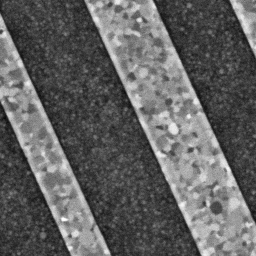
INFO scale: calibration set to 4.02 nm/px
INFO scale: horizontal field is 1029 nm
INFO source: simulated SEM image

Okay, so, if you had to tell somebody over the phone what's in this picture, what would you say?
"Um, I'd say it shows one or a few lines or trenches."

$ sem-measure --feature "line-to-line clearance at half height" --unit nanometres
343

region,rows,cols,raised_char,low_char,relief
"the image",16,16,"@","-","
------@@@@-----@
------@@@@-----@
@------@@@@-----
@------@@@@-----
@@-----@@@@-----
@@------@@@@----
@@------@@@@----
-@@------@@@@---
-@@------@@@@---
--@@------@@@@--
--@@------@@@@--
---@@------@@@@-
---@@------@@@@-
---@@@------@@@@
----@@------@@@@
----@@@-----@@@@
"